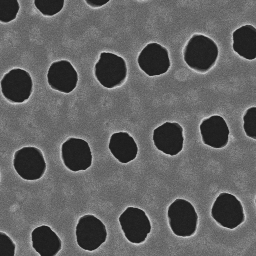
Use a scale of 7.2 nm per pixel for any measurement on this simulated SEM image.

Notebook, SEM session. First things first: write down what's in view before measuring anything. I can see a regular array of holes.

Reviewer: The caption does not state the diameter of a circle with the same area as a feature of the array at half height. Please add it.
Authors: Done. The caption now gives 230 nanometers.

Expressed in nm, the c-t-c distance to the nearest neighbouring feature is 335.